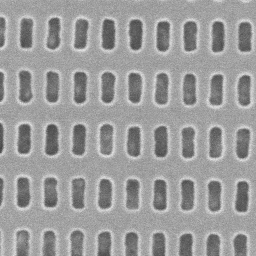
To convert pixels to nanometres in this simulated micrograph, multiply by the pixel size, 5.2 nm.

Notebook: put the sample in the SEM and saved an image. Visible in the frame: a regular array of holes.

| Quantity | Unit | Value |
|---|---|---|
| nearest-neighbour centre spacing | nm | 142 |